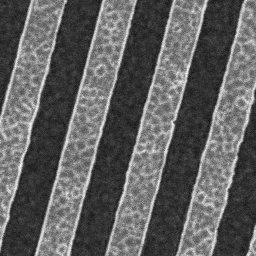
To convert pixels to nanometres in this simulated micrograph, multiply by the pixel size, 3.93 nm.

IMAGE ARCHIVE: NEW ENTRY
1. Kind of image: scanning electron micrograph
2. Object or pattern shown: one or a few lines or trenches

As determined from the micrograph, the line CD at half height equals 124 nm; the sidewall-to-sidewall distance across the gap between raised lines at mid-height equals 0.144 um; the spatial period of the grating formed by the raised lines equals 269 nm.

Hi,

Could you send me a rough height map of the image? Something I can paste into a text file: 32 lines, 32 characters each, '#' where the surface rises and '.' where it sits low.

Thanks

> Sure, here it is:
....####.....####.....####....##
....####.....####....####.....##
...####.....####.....####.....##
...####.....####.....####.....##
...####.....####.....####.....##
...####.....####....####.....###
..####.....####.....####.....###
..####.....####.....####.....###
..####.....####.....####....####
..####.....####....####.....####
.####.....####.....####.....####
.####.....####.....####.....####
.####.....####.....####....#####
#####....####.....####.....####.
####.....####.....####.....####.
####.....####.....####.....####.
####.....####....####.....####..
####....####.....####.....####..
###.....####.....####.....####..
###.....####.....####....#####..
###.....####....####.....####...
##.....####.....####.....####...
##.....####.....####.....####...
##.....####.....####....####....
##....####.....####.....####....
#.....####.....####.....####....
#.....####.....####.....####....
#.....####....#####....####.....
#....####.....####.....####.....
.....####.....####.....####.....
.....####.....####.....####....#
.....####....#####....####.....#